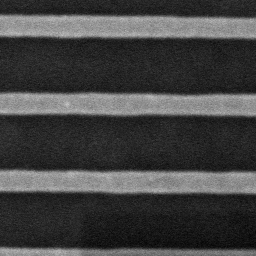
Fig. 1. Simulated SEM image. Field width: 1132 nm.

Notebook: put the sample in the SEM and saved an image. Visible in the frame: wiring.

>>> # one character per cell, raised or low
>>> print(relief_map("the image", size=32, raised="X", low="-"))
--------------------------------
--------------------------------
XXXXXXXXXXXXXXXXXXXXXXXXXXXXXXXX
XXXXXXXXXXXXXXXXXXXXXXXXXXXXXXXX
XXXXXXXXXXXXXXXXXXXXXXXXXXXXXXXX
--------------------------------
--------------------------------
--------------------------------
--------------------------------
--------------------------------
--------------------------------
--------------------------------
XXXXXXXXXXXXXXXXXXXXXXXXXXXXXXXX
XXXXXXXXXXXXXXXXXXXXXXXXXXXXXXXX
--------------------------------
--------------------------------
--------------------------------
--------------------------------
--------------------------------
--------------------------------
--------------------------------
XXXXX-XXXXX---------------------
XXXXXXXXXXXXXXXXXXXXXXXXXXXXXXXX
XXXXXXXXXXXXXXXXXXXXXXXXXXXXXXXX
--------------------------------
--------------------------------
--------------------------------
--------------------------------
--------------------------------
--------------------------------
--------------------------------
XXXXXXXXXXXXXXXXXXXXXXXXXXXXXXXX